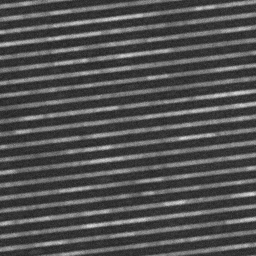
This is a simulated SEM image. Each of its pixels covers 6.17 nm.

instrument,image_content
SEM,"parallel lines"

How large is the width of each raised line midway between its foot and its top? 16.1 nanometres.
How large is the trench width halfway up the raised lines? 62.8 nm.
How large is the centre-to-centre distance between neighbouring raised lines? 78.3 nanometres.